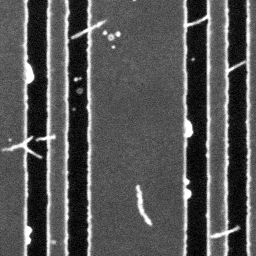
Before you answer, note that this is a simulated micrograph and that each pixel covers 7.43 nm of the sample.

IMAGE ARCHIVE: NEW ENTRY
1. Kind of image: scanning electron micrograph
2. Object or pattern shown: lines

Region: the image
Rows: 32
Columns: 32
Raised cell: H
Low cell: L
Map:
HHHLLLHHLLLHHHHHHHHHHHHLLLHHLLLH
HHHLLLHHHLLHHHHHHHHHHHHLLLHHLLLH
HHHLLLHHLLLHHHHHHHHHHHHLLLHHLLLH
HHHLLLHHLLLHHHHHHHHHHHHLLLHHLLLH
HHHLLLHHLLLHHHHHHHHHHHHLLLHHLLLH
HHHLLLHHLLLHHHHHHHHHHHHLLLHHLLLH
HHHLLLHHLLLHHHHHHHHHHHHLLLHHLLLH
HHHLLLHHLLLHHHHHHHHHHHHLLLHHLLLH
HHHHLLHHLLLHHHHHHHHHHHHLLLHHHLLH
HHHHLLHHLLLHHHHHHHHHHHHLLLHHLLLH
HHHHLLHHLLLHHHHHHHHHHHHLLLHHLLLH
HHHLLLHHLLLHHHHHHHHHHHHLLLHHLLLH
HHHLLLHHLLLHHHHHHHHHHHHLLLHHLLLH
HHHLLLHHLLLHHHHHHHHHHHHLLLHHLLLH
HHHLLLHHLLLHHHHHHHHHHHHLLLHHLLLH
HHHLLLHHLLLHHHHHHHHHHHHHLLHHLLLH
HHHLLLHHLLLHHHHHHHHHHHHHLLHHLLLH
HHHLLLHHLLLHHHHHHHHHHHHLLLHHLLLH
HHHHLLHHLLLHHHHHHHHHHHHLLLHHLLLH
HHHLLLHHLLLHHHHHHHHHHHHLLLHHLLLH
HHHLLLHHLLLHHHHHHHHHHHHLLLHHLLLH
HHHLLLHHLLLHHHHHHHHHHHHLLLHHLLLH
HHHLLLHHLLLHHHHHHHHHHHHLLLHHLLLH
HHHLLLHHLLLHHHHHHHHHHHHLLLHHLLLH
HHHLLLHHLLLHHHHHHHHHHHHHLLHHLLLH
HHHLLLHHLLLHHHHHHHHHHHHLLLHHLLLH
HHHLLLHHLLLHHHHHHHHHHHHLLLHHLLLH
HHHLLLHHLLLHHHHHHHHHHHHLLLHHLLLH
HHHHLLHHLLLHHHHHHHHHHHHLLLHHLLLH
HHHHLLHHLLLHHHHHHHHHHHHLLLHHLLLH
HHHLLLHHLLLHHHHHHHHHHHHLLLHHLLLH
HHHLLLHHLLLHHHHHHHHHHHHLLLHHLLLH